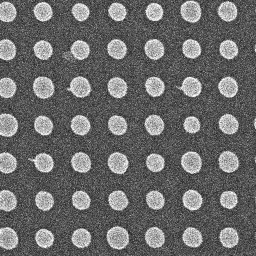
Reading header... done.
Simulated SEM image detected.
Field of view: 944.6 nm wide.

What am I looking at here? a regular array of raised bodies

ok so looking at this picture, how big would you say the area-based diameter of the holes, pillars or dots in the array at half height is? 69.9 nanometres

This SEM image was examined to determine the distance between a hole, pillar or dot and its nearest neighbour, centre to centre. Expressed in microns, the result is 0.136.